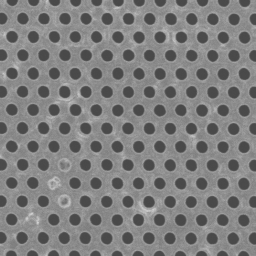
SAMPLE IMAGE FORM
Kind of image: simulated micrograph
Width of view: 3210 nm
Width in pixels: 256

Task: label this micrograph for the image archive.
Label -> a regular array of holes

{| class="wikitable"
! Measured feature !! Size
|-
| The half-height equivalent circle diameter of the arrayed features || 146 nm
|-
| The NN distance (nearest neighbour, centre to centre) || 262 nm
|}